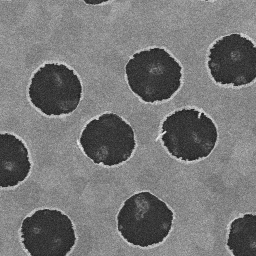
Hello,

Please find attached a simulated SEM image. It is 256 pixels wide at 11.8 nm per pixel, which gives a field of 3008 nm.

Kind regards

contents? holes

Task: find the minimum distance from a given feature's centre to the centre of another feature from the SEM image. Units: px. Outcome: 72.6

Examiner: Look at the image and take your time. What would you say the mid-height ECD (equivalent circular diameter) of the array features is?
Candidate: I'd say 624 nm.